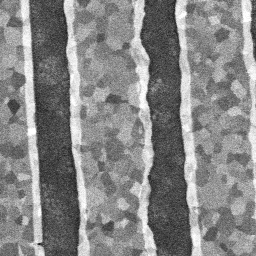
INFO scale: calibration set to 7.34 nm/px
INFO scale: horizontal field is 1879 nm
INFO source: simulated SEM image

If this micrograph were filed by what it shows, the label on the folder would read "one or a few lines or trenches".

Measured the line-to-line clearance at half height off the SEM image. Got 44 px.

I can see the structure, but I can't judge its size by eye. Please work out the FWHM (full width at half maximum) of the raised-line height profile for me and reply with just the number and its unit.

0.485 micrometres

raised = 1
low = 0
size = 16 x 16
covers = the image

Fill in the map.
1100111110011110
1100111110011110
1100111110011110
1100011110011111
1100011110001111
1100011110001111
1100011110001111
1100011110001111
1100011110001111
1100011110001111
1100011110001111
1100011110001111
1100011110001111
1100011110001111
1100011110001111
1100011110001111